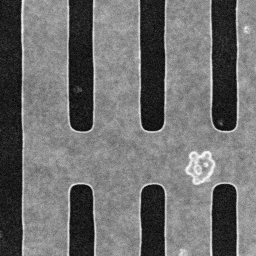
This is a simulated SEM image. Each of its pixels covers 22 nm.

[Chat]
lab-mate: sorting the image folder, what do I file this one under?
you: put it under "groups of lines, slits or small figures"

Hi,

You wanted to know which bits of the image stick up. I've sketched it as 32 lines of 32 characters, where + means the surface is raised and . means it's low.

...++++++...+++++....+++++....++
...++++++...+++++....+++++....++
...++++++...+++++....+++++....++
...++++++...+++++....+++++....++
...++++++...+++++....+++++....++
...++++++...+++++....+++++....++
...++++++...+++++....+++++....++
...++++++...+++++....+++++....++
...+++++....+++++....+++++....++
...+++++....+++++....+++++....++
...++++++...+++++....+++++....++
...++++++...+++++....+++++....++
...++++++...+++++....+++++....++
...++++++...+++++....+++++....++
...++++++...+++++....+++++....++
...++++++...++++++...++++++...++
...+++++++++++++++++++++++++++++
...+++++++++++++++++++++++++++++
...+++++++++++++++++++++++++++++
...+++++++++++++++++++++++++++++
...+++++++++++++++++++++++++++++
...+++++++++++++++++++++++++++++
...+++++++++++++++++++++++++++++
...++++++..+++++++..+++++++..+++
...++++++...++++++...++++++...++
...++++++...+++++....+++++....++
...++++++...+++++....+++++....++
...++++++...+++++....+++++....++
...++++++...++++++...+++++....++
...++++++...++++++...+++++....++
...++++++...++++++...+++++....++
...++++++...+++++....+++++....++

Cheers